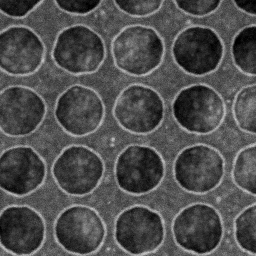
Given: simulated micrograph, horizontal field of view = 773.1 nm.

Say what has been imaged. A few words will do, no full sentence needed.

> a regular array of holes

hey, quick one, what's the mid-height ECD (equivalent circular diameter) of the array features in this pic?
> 49.4 pixels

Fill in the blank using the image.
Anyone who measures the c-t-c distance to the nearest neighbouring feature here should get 0.18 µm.